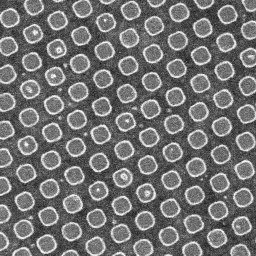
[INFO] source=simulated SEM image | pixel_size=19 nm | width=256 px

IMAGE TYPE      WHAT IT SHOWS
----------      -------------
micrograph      a regular array of raised bodies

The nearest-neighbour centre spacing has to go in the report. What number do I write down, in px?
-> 27.6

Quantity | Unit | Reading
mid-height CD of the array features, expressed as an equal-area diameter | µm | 0.342